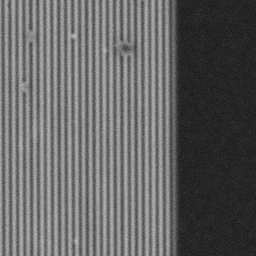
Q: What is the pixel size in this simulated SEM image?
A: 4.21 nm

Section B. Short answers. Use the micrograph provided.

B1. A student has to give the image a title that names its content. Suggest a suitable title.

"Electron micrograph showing parallel lines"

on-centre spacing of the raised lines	29.4	nm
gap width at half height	15.8	nanometers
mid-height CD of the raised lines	0.0158	µm